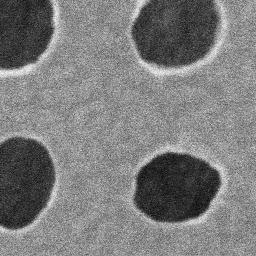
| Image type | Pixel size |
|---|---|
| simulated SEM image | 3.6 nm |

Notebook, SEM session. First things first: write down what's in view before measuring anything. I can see holes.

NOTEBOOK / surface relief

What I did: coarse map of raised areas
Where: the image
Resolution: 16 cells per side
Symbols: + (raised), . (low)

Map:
...++++++.....++
...+++++......++
...+++++......++
...++++++....+++
++++++++++++++++
++++++++++++++++
++++++++++++++++
++++++++++++++++
++++++++++++++++
...+++++++++++++
...++++++....+++
...+++++......++
...+++++.....+++
..+++++++...++++
++++++++++++++++
++++++++++++++++